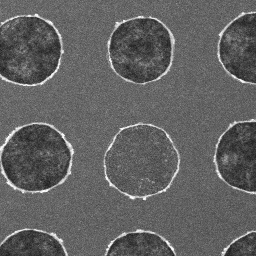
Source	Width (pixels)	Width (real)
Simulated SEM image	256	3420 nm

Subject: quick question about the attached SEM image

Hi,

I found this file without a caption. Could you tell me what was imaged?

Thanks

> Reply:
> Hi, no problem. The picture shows holes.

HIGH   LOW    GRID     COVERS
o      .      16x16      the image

oooooooooooooooo
...ooooo..oooo..
....ooo....ooo..
....ooo....ooo..
...oooo...oooo..
oooooooooooooooo
oooooooooooooooo
oooooooooooooooo
o...oooooooooo..
....oooooooooo..
....oooo...ooo..
o...ooooo..ooo..
oooooooooooooooo
oooooooooooooooo
o..ooooooooooooo
....ooo....ooo..